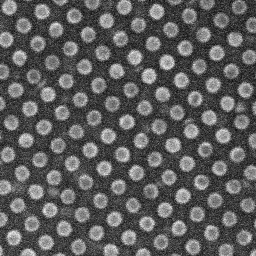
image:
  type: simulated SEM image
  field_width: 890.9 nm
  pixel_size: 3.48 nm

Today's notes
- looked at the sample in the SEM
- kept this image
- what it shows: a regular array of raised bodies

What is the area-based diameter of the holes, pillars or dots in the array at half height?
47.2 nm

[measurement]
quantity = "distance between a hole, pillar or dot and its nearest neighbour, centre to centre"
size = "22.8 pixels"